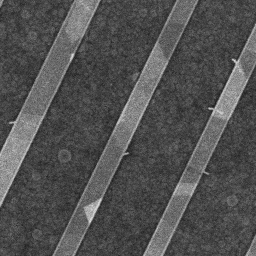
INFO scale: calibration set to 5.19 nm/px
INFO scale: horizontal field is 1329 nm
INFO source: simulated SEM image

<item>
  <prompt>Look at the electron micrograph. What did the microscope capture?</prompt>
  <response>one or a few lines or trenches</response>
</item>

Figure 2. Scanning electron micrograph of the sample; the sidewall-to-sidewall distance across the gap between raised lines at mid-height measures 328 nm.